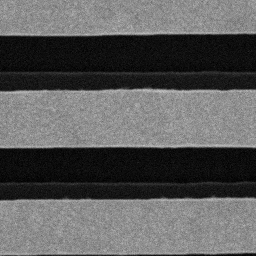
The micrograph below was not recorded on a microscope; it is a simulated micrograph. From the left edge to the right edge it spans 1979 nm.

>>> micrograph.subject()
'lines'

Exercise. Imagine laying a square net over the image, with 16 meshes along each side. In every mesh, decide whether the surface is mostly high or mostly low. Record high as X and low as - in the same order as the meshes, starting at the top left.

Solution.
XXXXXXXXXXXXXXXX
XXXXXXXXXXXXXXXX
----------------
----------------
----------------
----------------
XXXXXXXXXXXXXXXX
XXXXXXXXXXXXXXXX
XXXXXXXXXXXXXXXX
----------------
----------------
----------------
---------XXXXXXX
XXXXXXXXXXXXXXXX
XXXXXXXXXXXXXXXX
XXXXXXXXXXXXXXXX